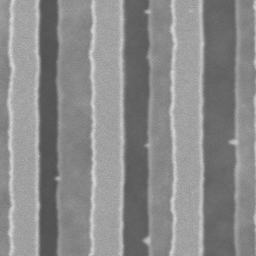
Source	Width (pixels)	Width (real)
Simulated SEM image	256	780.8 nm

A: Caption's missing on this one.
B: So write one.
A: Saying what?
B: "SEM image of lines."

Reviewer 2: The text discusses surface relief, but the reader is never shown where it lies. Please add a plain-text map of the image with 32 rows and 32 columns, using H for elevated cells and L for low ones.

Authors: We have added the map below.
HHHHHLLHHHHHHHHLLLLHHHHHHLLLLLHH
HHHHHLLHHHHHHHHLLLHHHHHHHLLLLLHH
HHHHHLLHHHHHHHHLLLLHHHHHHLLLLLHH
HHHHHLLHHHHHHHHLLLLHHHHHHLLLLLHH
HHHHHLLHHHHHHHHLLLLHHHHHHLLLLLHH
HHHHHLLHHHHHHHHLLLLHHHHHHLLLLLHH
HHHHHLLHHHHHHHHLLLLHHHHHHLLLLLHH
HHHHHLLHHHHHHHHLLLLHHHHHHLLLLLHH
HHHHHLLHHHHHHHHLLLLHHHHHHLLLLLHH
HHHHHLLHHHHHHHHLLLLHHHHHHLLLLLHH
HHHHHLLHHHHHHHHLLLLHHHHHHLLLLLHH
HHHHHLLHHHHHHHHLLLLHHHHHHLLLLLHH
HHHHHLLHHHHHHHHLLLLHHHHHHLLLLLHH
HHHHHLLHHHHHHHHLLLLHHHHHHLLLLLHH
HHHHHLLHHHHHHHHLLLLHHHHHHLLLLLHH
HHHHHLLHHHHHHHHLLLLHHHHHHLLLLHHH
HHHHHLLHHHHHHHHLLLHHHHHHHLLLLLHH
HHHHHLLHHHHHHHHLLLLHHHHHHLLLLHHH
HHHHHLLHHHHHHHHLLLHHHHHHHLLLLHHH
HHHHHLLHHHHHHHHLLLLHHHHHHLLLLLHH
HHHHHLLHHHHHHHHLLLLHHHHHHLLLLLHH
HHHHHLLHHHHHHHHLLLLHHHHHHLLLLHHH
HHHHHLLHHHHHHHHLLLLHHHHHHLLLLHHH
HHHHHLLHHHHHHHHLLLHHHHHHHLLLLLHH
HHHHHLLHHHHHHHHLLLHHHHHHHLLLLHHH
HHHHHLLHHHHHHHHLLLHHHHHHHLLLLHHH
HHHHHLLHHHHHHHHLLLLHHHHHHLLLLHHH
HHHHHLLHHHHHHHHLLLLHHHHHHLLLLHHH
HHHHHLLHHHHHHHHLLLLHHHHHHLLLLHHH
HHHHHLLHHHHHHHHLLLHHHHHHHLLLLHHH
HHHHHLLHHHHHHHHLLLHHHHHHHLLLLHHH
HHHHHLLHHHHHHHHLLLLHHHHHHLLLLLHH